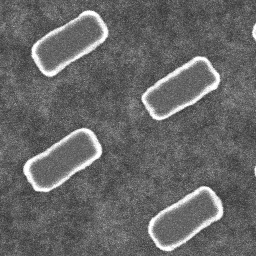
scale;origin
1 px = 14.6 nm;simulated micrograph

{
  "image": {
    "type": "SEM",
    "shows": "raised bodies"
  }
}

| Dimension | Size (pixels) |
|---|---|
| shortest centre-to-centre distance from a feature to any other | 119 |